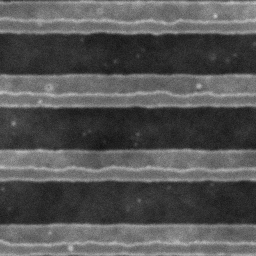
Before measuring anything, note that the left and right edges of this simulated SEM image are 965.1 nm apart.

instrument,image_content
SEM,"lines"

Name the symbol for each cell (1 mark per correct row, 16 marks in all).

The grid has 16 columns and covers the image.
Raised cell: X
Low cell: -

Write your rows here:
XXXXXXXXXXXXXXXX
XXXXXXXXXXXXXXXX
----------------
----------------
----------------
XXXXXXXXXXXXXXXX
XXXXXXXXXXXXXXXX
----------------
----------------
XXXXXXXXXXXXXXXX
XXXXXXXXXXXXXXXX
----------------
----------------
----------------
XXXXXXXXXXXXXXXX
XXXXXXXXXXXXXXXX